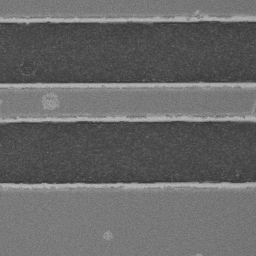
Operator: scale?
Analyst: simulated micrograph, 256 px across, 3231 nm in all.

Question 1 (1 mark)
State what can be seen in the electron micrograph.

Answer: one or a few lines or trenches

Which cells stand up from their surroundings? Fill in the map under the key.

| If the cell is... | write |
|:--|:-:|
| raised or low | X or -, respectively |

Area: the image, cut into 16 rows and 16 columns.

XXXXXXXXXXXXXXXX
----------------
----------------
----------------
----------------
XXXXXXXXXXXXXXXX
XXXXXXXXXXXXXXXX
X---------------
----------------
----------------
----------------
----------------
XXXXXXXXXXXXXXXX
XXXXXXXXXXXXXXXX
XXXXXXXXXXXXXXXX
XXXXXXXXXXXXXXXX